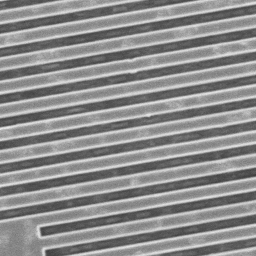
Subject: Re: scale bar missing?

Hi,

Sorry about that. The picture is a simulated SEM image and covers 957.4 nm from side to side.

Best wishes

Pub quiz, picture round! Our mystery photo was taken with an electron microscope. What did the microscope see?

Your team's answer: parallel lines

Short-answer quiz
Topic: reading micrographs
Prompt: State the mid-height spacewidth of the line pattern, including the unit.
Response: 36.5 nm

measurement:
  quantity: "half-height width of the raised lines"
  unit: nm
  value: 48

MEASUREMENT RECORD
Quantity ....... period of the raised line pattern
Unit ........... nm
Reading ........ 85.9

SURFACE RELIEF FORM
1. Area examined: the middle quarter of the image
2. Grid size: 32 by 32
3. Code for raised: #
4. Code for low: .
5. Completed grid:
.......##################.......
.##################.............
#############...............####
#######...............##########
#.................##############
...........###################..
.....###################........
###################.............
#############...............####
#######...............##########
#...............################
..........###################...
....###################.........
##################..............
###########...............######
#####...............############
#.............##################
.........##################.....
...###################..........
################................
###########.............########
####................############
..............##################
........##################......
.####################...........
###############...............##
#########...............########
###...............##############
............####################
......####################......
.###################............
##############................##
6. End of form